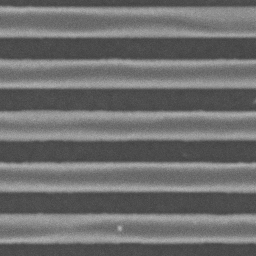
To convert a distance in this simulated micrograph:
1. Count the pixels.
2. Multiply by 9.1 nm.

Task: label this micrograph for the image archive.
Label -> lines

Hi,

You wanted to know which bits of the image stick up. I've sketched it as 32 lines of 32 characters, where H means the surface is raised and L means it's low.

LLLLLLLLLLLLLLLLLLLLLLLLLLLLLLLL
HHHHHHHHHHHHHHHHHHHHHHHHHHHHHHHH
HHHHHHHHHHHHHHHHHHHHHHHHHHHHHHHH
HHHHHHHHHHHHHHHHHHHHHHHHHHHHHHHH
HHHHHHHHHHHHHHHHHHLLLHHHHHHHHHHH
LLLLLLLLLLLLLLLLLLLLLLLLLLLLLLLL
LLLLLLLLLLLLLLLLLLLLLLLLLLLLLLLL
LLLLLLLLLLLLHHHHHLLLLLLLLLLHHHHH
HHHHHHHHHHHHHHHHHHHHHHHHHHHHHHHH
HHHHHHHHHHHHHHHHHHHHHHHHHHHHHHHH
HHHHHHHHHHHHHHHHHHHHHHHHHHHHHHHH
LLLLLLLLLLLLLLLLLLLLLLLLLLLLLLLL
LLLLLLLLLLLLLLLLLLLLLLLLLLLLLLLL
LLLLLLLLLLLLLLLLLLLLLLLLLLLLLLLL
HHHHHHHHHHHHHHHHHHHHHHHHHHHHHHHH
HHHHHHHHHHHHHHHHHHHHHHHHHHHHHHHH
HHHHHHHHHHHHHHHHHHHHHHHHHHHHHHHH
LLLLLLLLLLLLLLLLLLLLLLLLLLLLLLLL
LLLLLLLLLLLLLLLLLLLLLLLLLLLLLLLL
LLLLLLLLLLLLLLLLLLLLLLLLLLLLLLLL
HHHHHHLLHHHHHHHHHHHHHHHHHHHHHHHH
HHHHHHHHHHHHHHHHHHHHHHHHHHHHHHHH
HHHHHHHHHHHHHHHHHHHHHHHHHHHHHHHH
HHHHHHHHHHHHHHHHHHHHHHHHHHHHHHHH
LLLLLLLLLLLLLLLLLLLLLLLLLLLLLLLL
LLLLLLLLLLLLLLLLLLLLLLLLLLLLLLLL
LLLLLLLLLLLLLLLLLLLLLLLLLLLLLLLL
HHHHHHHHHHHHHHHHHHHHHHHHHHHHHHHH
HHHHHHHHHHHHHHHHHHHHHHHHHHHHHHHH
HHHHHHHHHHHHHHHHHHHHHHHHHHHHHHHH
LLLLLLLLLLLLLLLLLLLLLLLLLLLLLLLL
LLLLLLLLLLLLLLLLLLLLLLLLLLLLLLLL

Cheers